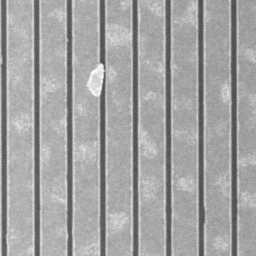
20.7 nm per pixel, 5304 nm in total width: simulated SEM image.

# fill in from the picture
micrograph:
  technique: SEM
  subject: parallel lines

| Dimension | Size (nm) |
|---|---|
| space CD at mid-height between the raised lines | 161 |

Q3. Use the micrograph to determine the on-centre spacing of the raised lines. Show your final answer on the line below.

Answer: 680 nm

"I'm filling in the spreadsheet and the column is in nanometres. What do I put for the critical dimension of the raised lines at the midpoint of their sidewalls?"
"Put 521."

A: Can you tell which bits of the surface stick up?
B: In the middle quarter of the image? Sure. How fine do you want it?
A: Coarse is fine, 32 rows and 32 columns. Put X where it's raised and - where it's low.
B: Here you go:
--XXXXXXXX-XXXXXX--XXXXXX--XXXXX
--XXXXXXXX-XXXXXX--XXXXXX--XXXXX
--XXXXXXXX-XXXXXX--XXXXXX--XXXXX
--XXXXXXXX-XXXXXX--XXXXXX--XXXXX
--XXXXXXX--XXXXXX--XXXXXX--XXXXX
---XXXXXX--XXXXXX--XXXXXX--XXXXX
---XXXXXX--XXXXXX--XXXXXX--XXXXX
---XXXXXX--XXXXXX--XXXXXX--XXXXX
---XXXXXX--XXXXXX--XXXXXX--XXXXX
---XXXXXX--XXXXXX--XXXXXX--XXXXX
---XXXXXX--XXXXXX--XXXXXX--XXXXX
---XXXXXX-XXXXXXX--XXXXXX--XXXXX
---XXXXXX-XXXXXXX--XXXXXX--XXXXX
---XXXXXX--XXXXXX--XXXXXX--XXXXX
---XXXXXX--XXXXXX--XXXXXX--XXXXX
---XXXXXX-XXXXXXX--XXXXXX--XXXXX
---XXXXXX--XXXXXX--XXXXXX--XXXXX
--XXXXXXX--XXXXXX--XXXXXX--XXXXX
---XXXXXX--XXXXXX--XXXXXX--XXXXX
---XXXXXX--XXXXXX--XXXXXX--XXXXX
---XXXXXX--XXXXXX--XXXXXX--XXXXX
---XXXXXX--XXXXXX--XXXXXX--XXXXX
---XXXXXX--XXXXXX--XXXXXX--XXXXX
---XXXXXX--XXXXXX--XXXXXX--XXXXX
---XXXXXX--XXXXXX--XXXXXX--XXXXX
---XXXXXX--XXXXXX--XXXXXX--XXXXX
---XXXXXX--XXXXXX--XXXXXX--XXXXX
---XXXXXX--XXXXXX--XXXXXX--XXXXX
---XXXXXX--XXXXXX--XXXXXX--XXXXX
---XXXXXX--XXXXXX--XXXXXX--XXXXX
---XXXXXX--XXXXXX--XXXXXX--XXXXX
---XXXXXX--XXXXXX--XXXXXX--XXXXX